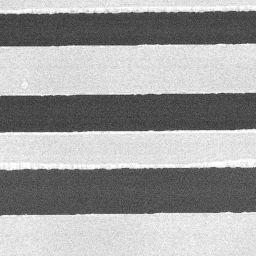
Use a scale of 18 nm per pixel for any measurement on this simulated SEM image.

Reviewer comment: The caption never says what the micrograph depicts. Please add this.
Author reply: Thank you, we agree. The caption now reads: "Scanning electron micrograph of lines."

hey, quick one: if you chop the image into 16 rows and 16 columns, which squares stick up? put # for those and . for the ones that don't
################
................
................
################
################
################
................
................
################
################
................
................
................
################
################
################